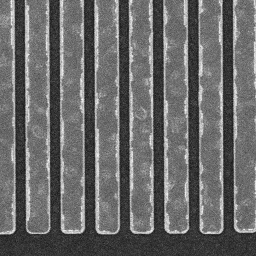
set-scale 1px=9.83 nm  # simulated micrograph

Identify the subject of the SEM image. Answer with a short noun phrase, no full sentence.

parallel lines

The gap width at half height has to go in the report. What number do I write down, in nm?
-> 117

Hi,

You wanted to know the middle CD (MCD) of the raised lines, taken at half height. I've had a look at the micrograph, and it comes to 226 nanometres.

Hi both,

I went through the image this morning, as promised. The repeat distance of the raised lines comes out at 34.7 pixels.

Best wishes